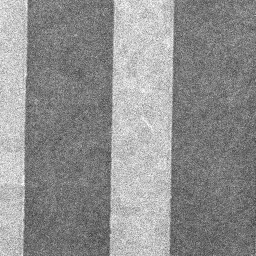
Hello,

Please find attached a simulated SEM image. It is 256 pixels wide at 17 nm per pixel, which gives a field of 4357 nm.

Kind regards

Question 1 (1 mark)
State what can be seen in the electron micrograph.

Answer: one or a few lines or trenches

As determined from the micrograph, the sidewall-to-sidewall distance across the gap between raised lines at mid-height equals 1500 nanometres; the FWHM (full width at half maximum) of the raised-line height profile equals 0.998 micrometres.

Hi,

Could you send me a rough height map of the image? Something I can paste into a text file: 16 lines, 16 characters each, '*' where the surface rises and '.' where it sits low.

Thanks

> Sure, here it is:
**.....****.....
**.....****.....
**.....****.....
**.....****.....
**.....****.....
**.....****.....
*......****.....
*......****.....
*......****.....
*......****.....
*......****.....
*......****.....
*......****.....
*......****.....
*......****.....
*......****.....